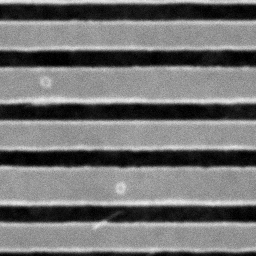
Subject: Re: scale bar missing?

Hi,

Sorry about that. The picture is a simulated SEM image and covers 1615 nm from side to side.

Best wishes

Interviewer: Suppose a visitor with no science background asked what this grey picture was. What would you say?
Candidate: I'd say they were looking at lines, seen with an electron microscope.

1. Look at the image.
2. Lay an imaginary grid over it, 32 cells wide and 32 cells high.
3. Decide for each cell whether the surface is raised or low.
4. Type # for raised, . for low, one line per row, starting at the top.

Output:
.......#........................
................................
................................
################################
################################
################################
................................
................................
................############..#.
################################
################################
################################
################################
................................
................................
################################
################################
################################
################################
................................
................................
################################
################################
################################
################################
################################
................................
................................
################################
################################
################################
..................##............